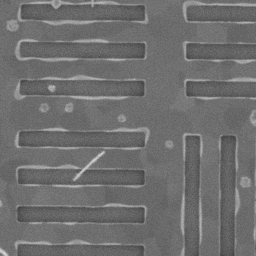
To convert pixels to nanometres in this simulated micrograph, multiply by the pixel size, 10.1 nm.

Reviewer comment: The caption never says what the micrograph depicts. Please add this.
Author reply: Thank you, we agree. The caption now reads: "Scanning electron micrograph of groups of lines, slits or small figures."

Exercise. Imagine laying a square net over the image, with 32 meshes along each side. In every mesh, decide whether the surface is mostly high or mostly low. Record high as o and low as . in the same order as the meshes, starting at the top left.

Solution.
ooo...oo.......oooooooo..ooooooo
oo................ooooo.........
ooo...............ooooo.........
oooooooooooooooooooooooooooooooo
oooooooooooooooooooooooooooooooo
oo................ooooo.........
oo................ooooo.........
oooooooooooooooooooooooooo..o...
oooooooooooooooooooooooooooooooo
oooooooooooooooooooooooooooooooo
oo................ooooo.........
oo................ooooo.........
oooooooooooooooooooooooooooooooo
oooooooooooooooooooooooooooooooo
oooooooooooooooooooooooooooooooo
oooooooooooooooooooooooooooooooo
ooo...............oooooooooooooo
oo................ooooo..ooo..oo
oooooooo..oo......ooooo..oo...oo
ooooooooooooooooooooooo..oo...oo
ooooooooooooooooooooooo..oo...oo
oo................ooooo..oo...oo
oo................ooooo..oo..ooo
ooooooooooooooooooooooo..oo..ooo
ooooooooooooooooooooooo..oo...oo
ooooooooooooooooooooooo..oo...oo
oo................ooooo..oo..ooo
oo................ooooo..oo..ooo
ooooooooooooooooooooooo..oo..ooo
ooooooooooooooooooooooo..oo..ooo
oo....oo...oo.ooooooooo..oo..ooo
oo................ooooo..oo..ooo